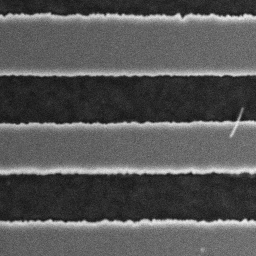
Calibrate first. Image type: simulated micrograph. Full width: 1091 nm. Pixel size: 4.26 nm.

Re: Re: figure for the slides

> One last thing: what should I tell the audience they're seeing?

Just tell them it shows lines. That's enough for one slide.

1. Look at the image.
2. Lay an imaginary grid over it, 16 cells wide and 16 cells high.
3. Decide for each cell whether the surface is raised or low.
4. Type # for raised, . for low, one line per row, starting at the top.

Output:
................
################
################
################
################
................
................
................
################
################
################
................
................
................
################
################